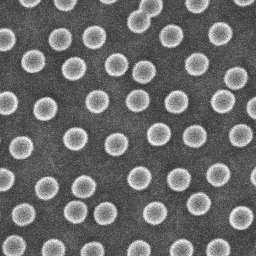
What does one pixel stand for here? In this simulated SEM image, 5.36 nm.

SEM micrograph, a regular array of raised bodies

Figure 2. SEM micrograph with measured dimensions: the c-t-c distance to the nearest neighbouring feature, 188 nanometers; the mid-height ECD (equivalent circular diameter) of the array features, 116 nm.